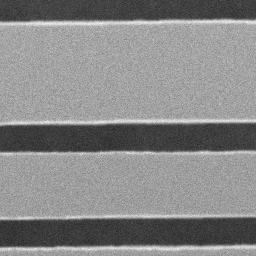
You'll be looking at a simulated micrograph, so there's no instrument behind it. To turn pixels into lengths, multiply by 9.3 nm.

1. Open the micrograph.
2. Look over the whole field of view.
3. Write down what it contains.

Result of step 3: lines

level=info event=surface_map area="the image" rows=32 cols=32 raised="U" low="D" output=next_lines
DDDDDDDDDDDDDDDDDDDDDDDDDDDDDDDD
DDDDDDDDDDDDDDDDDDDDDDDDDDDDDDDD
DDDDDDDDDDDDDDDDDDDDDDDDDDDDDDDD
UUUUUUUUUUUUUUUUUUUUUUUUUUUUUUUU
UUUUUUUUUUUUUUUUUUUUUUUUUUUUUUUU
UUUUUUUUUUUUUUUUUUUUUUUUUUUUUUUU
UUUUUUUUUUUUUUUUUUUUUUUUUUUUUUUU
UUUUUUUUUUUUUUUUUUUUUUUUUUUUUUUU
UUUUUUUUUUUUUUUUUUUUUUUUUUUUUUUU
UUUUUUUUUUUUUUUUUUUUUUUUUUUUUUUU
UUUUUUUUUUUUUUUUUUUUUUUUUUUUUUUU
UUUUUUUUUUUUUUUUUUUUUUUUUUUUUUUU
UUUUUUUUUUUUUUUUUUUUUUUUUUUUUUUU
UUUUUUUUUUUUUUUUUUUUUUUUUUUUUUUU
UUUUUUUUUUUUUUUUUUUUUUUUUUUUUUUU
UUUUDDDDDDDDDDDDDDDDDDDDDDDDDDDD
DDDDDDDDDDDDDDDDDDDDDDDDDDDDDDDD
DDDDDDDDDDDDDDDDDDDDDDDDDDDDDDDD
DDDDDDDDDDDDDDDDDDDDDDDDDDDDDDDD
UUUUUUUUUUUUUUUUUUUUUUUUUUUUUUUU
UUUUUUUUUUUUUUUUUUUUUUUUUUUUUUUU
UUUUUUUUUUUUUUUUUUUUUUUUUUUUUUUU
UUUUUUUUUUUUUUUUUUUUUUUUUUUUUUUU
UUUUUUUUUUUUUUUUUUUUUUUUUUUUUUUU
UUUUUUUUUUUUUUUUUUUUUUUUUUUUUUUU
UUUUUUUUUUUUUUUUUUUUUUUUUUUUUUUU
UUUUUUUUUUUUUUUUUUUUUUUUUUUUUUUU
DDDDDDDDDDDDDDDDDDDDDDDDDDDDDDDD
DDDDDDDDDDDDDDDDDDDDDDDDDDDDDDDD
DDDDDDDDDDDDDDDDDDDDDDDDDDDDDDDD
DDDDDDDDDDDDDDDDDDDDDDDDDDDDDDDD
UUUUUUUUUUUUUUUUUUUUUUUUUUUUUUUU